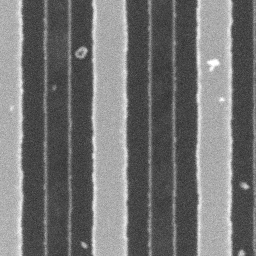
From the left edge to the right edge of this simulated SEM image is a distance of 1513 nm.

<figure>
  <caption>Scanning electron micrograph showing lines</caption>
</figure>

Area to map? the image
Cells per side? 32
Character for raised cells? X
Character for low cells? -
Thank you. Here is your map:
XXX---XXX---XXXX---XXX---XXXX---
XXX---XXX---XXXX---XXX---XXXX---
XXX---XXX---XXXX---XXX---XXXX---
XXX---XXX---XXXX---XXX---XXXX---
XXX---XXX---XXXX---XXX---XXXX---
XXX---XXX---XXXX---XXX---XXXX---
XXX---XXX-X-XXXX---XXX---XXXX---
XXX---XXX---XXXX---XXX---XXXX---
XXX---XXX---XXXX---XXX---XXXX---
XXX---XXX---XXXX---XXX---XXXX---
XXX---XXX---XXXX---XXX---XXXX---
XXX---XXX---XXXX---XXX---XXXX---
XXX---XXX---XXXX---XXX---XXXX---
XXX---XXX---XXXX---XXX---XXXX---
XXX---XXX---XXXX---XXX---XXXX---
XXX---XXX---XXXX---XXX---XXXX---
XXX---XXX---XXXX---XXX---XXXX---
XXX---XXX---XXXX---XXX---XXXX---
XXX---XXX---XXXX---XXX---XXXX---
XXX---XXX---XXXX---XXX---XXXX---
XXX---XXX---XXXX---XXX---XXXX---
XXX---XXX---XXXX---XXX---XXXX---
XXX---XXX---XXXX---XXX---XXXX---
XXX---XXX---XXXX---XXX---XXXX---
XXX---XXX---XXXX---XXX---XXXX---
XXX---XXX---XXXX---XXX---XXXX---
XXX---XXX---XXXX---XXX---XXXX---
XXX---XXX---XXXX---XXX---XXXX---
XXX---XXX---XXXX---XXX---XXXX---
XXX---XXX---XXXX---XXX---XXXX---
XXX---XXX---XXXX---XXX---XXXX---
XXX---XXX---XXXX---XXX---XXXX---